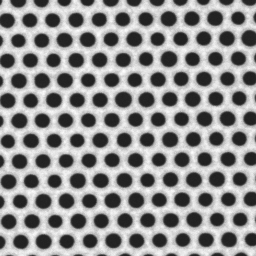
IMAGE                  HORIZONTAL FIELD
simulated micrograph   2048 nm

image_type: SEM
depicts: a regular array of holes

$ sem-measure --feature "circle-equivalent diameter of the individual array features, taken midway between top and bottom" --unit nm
120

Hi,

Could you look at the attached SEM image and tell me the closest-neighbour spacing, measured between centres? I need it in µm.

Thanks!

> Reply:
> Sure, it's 0.183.